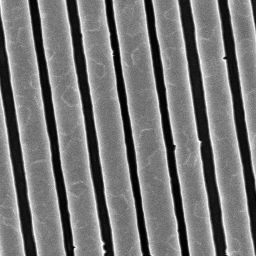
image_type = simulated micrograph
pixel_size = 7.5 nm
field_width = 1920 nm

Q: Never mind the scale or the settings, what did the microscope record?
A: parallel lines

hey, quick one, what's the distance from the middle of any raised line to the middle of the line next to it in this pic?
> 282 nm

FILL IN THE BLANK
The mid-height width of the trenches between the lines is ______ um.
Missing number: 0.0687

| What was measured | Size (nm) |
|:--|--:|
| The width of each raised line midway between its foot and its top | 212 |